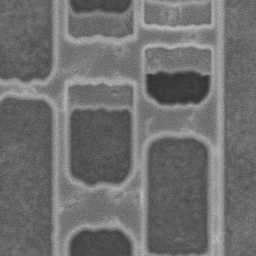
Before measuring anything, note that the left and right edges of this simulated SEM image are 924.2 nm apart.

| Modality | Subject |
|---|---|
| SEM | one or a few lines or trenches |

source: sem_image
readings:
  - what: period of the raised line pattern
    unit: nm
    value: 280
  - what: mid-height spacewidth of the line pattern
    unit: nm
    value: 228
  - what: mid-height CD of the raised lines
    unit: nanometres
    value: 51.7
